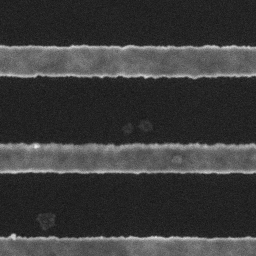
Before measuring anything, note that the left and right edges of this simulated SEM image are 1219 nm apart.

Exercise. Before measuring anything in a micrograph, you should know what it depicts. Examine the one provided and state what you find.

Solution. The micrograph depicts lines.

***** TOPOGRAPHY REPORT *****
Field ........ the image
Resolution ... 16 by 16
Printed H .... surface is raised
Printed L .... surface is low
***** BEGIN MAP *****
LLLLLLLLLLLLLLLL
LLLLLLLLLLLLLLLL
LLLLLLLLLLLLLLLL
HHHHHHHHHHHHHHHH
HHHHHHHHHHHHHHHH
LLLLLLLLLLLLLLLL
LLLLLLLLLLLLLLLL
LLLLLLLLLLLLLLLL
LLLLLLLLLLLLLLLL
HHHHHHHHHHHHHHHH
HHHHHHHHHHHHHHHH
LLLLLLLLLLLLLLLL
LLLLLLLLLLLLLLLL
LLLLLLLLLLLLLLLL
LLLLLLLLLLLLLLLL
HHHHHHHHHHHHHHHH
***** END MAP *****